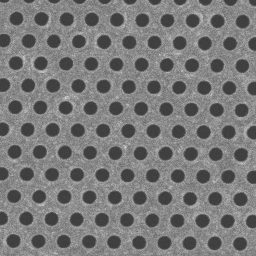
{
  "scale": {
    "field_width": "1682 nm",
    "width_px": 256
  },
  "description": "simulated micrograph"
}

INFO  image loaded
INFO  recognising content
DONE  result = a regular array of holes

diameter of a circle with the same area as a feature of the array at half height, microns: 0.0893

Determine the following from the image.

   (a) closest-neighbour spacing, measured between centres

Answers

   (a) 165 nm